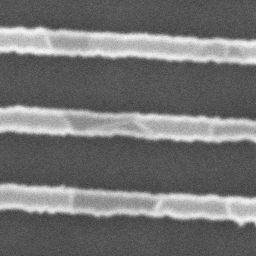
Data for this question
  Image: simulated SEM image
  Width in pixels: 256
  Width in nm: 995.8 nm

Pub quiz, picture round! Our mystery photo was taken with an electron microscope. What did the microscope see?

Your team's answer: lines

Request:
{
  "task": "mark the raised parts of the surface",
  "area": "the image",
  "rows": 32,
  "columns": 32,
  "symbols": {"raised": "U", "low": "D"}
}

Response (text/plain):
DDDDDDDDDDDDDDDDDDDDDDDDDDDDDDDD
DDDDDDDDDDDDDDDDDDDDDDDDDDDDDDDD
DDDDDDDDDDDDDDDDDDDDDDDDDDDDDDDD
DDDDDDDDDDDDDDDDDDDDDDDDDDDDDDDD
UUUUUUUUUUUUUUUUUUUDDDDDDDDDDDDD
UUUUUUUUUUUUUUUUUUUUUUUUUUUUUUUU
DDUUUUUUUUUUUUUUUUUUUUUUUUUUUUUU
DDDDDDDDDDDDDDDDDDDDDDUDUUUUUUUU
DDDDDDDDDDDDDDDDDDDDDDDDDDDDDDDD
DDDDDDDDDDDDDDDDDDDDDDDDDDDDDDDD
DDDDDDDDDDDDDDDDDDDDDDDDDDDDDDDD
DDDDDDDDDDDDDDDDDDDDDDDDDDDDDDDD
DDDDDDDDDDDDDDDDDDDDDDDDDDDDDDDD
DDUDDDDDDDDDDDDDDDDDDDDDDDDDDDDD
UUUUUUUUUUUUUUUUUUUDDDDDDDDDDDDD
UUUUUUUUUUUUUUUUUUUUUUUUUUUUUUUU
DDDDDUUUUUUUUUUUUUUUUUUUUUUUUUUU
DDDDDDDDDDDDDDDDDDDDDDDUDDUUDDDD
DDDDDDDDDDDDDDDDDDDDDDDDDDDDDDDD
DDDDDDDDDDDDDDDDDDDDDDDDDDDDDDDD
DDDDDDDDDDDDDDDDDDDDDDDDDDDDDDDD
DDDDDDDDDDDDDDDDDDDDDDDDDDDDDDDD
DDDDDDDDDDDDDDDDDDDDDDDDDDDDDDDD
UUUUUDDDDDDDDDDDDDDDDDDDDDDDDDDD
UUUUUUUUUUUUUUUUUUUUUUUUUDUDDDDD
UUUUUUUUUUUUUUUUUUUUUUUUUUUUUUUU
DDDDDDUDDUUUUUUUUUUUUUUUUUUUUUUU
DDDDDDDDDDDDDDDDDDDDDDDDDDDDDUUU
DDDDDDDDDDDDDDDDDDDDDDDDDDDDDDDD
DDDDDDDDDDDDDDDDDDDDDDDDDDDDDDDD
DDDDDDDDDDDDDDDDDDDDDDDDDDDDDDDD
DDDDDDDDDDDDDDDDDDDDDDDDDDDDDDDD